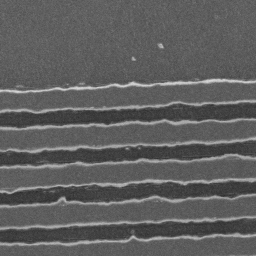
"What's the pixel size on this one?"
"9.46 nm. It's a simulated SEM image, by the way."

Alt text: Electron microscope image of parallel lines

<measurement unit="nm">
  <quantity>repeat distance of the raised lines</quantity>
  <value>364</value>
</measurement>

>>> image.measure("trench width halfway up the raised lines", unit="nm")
146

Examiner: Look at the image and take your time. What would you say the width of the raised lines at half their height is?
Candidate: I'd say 215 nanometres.